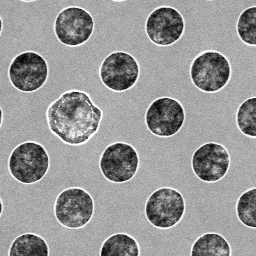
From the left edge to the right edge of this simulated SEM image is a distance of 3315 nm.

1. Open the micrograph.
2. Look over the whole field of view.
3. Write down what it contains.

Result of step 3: a regular array of holes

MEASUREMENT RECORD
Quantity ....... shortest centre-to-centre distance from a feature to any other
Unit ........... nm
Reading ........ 831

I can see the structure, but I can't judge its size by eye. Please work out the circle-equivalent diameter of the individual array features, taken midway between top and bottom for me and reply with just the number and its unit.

498 nm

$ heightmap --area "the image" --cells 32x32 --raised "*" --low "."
********************************
********...********...*********.
*******.....******.....*******..
*******.....******.....*******..
*******....********...********..
********..**********.**********.
**************************.*****
**...********....*******....****
*.....*******....*******.....***
*.....*******....*******.....***
**...********....*******....****
*********.**********************
*******....*********..*********.
******......*******....*******..
******.......*****.....*******..
******......******.....*******..
*******.....*******...********..
********...*********************
**...********....********...****
*.....*******....*******.....***
*.....*******....*******.....***
*.....*******....*******....****
**...*********..*********..*****
********************************
*******....********....*******..
*******.....******.....*******..
*******.....******.....*******..
*******....********...********..
********************************
***..*********..*********...****
**....*******....*******....****
*.....*******....*******.....***